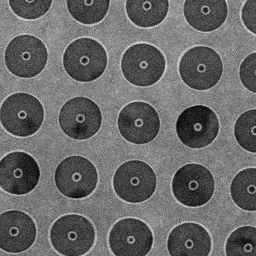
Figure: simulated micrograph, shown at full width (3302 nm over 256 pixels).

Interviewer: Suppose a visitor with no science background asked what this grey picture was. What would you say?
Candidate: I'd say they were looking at an array of small figures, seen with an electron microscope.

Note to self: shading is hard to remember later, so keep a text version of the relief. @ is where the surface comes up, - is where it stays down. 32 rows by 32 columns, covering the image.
@-----@@------@@--@--@@-----@@--
@@----@@@----@@@-----@@--@--@@--
@@@@@@@@@----@@@----@@@-----@@--
@@@@@@@@@@@@@@@@@@@@@@@@---@@@@-
@@--@@@@@@@@@@@@@@@@@@@@@@@@@@@@
@----@@@@----@@@@--@@@@@@@@@@@@@
@-----@@-----@@@----@@@----@@@@@
@-----@@--@--@@------@------@@--
@----@@@-----@@------@---@--@@--
@@--@@@@@----@@-----@@@-----@@--
@@@@@@@@@@@@@@@@@--@@@@----@@@--
@@@@@@@@@@@@@@@@@@@@@@@@@@@@@@@@
@----@@@@--@@@@@@@@@@@@@@@@@@@@@
-----@@@----@@@----@@@@---@@@@@@
--@---@------@@-----@@-----@@@--
-----@@------@@--@--@@-----@@---
@---@@@@----@@@-----@@-----@@---
@@@@@@@@@@@@@@@@---@@@@----@@@--
@@@@@@@@@@@@@@@@@@@@@@@@-@@@@@--
@---@@@@@-@@@@@@@@@@@@@@@@@@@@@@
-----@@-----@@@---@@@@@--@@@@@@@
--@--@@-----@@-----@@@----@@@@--
-----@@-----@@------@@-----@@---
----@@@-----@@-----@@------@@--@
@@@@@@@@---@@@@----@@@----@@@---
@@@@@@@@@@@@@@@@@@@@@@@---@@@---
@--@@@@@@@@@@@@@@@@@@@@@@@@@@@@@
----@@@----@@@@---@@@@@@@@@@@@@@
-----@------@@-----@@@----@@@@--
-----@------@@-----@@-----@@@---
----@@------@@-----@@--@---@----
@--@@@@----@@@-----@@-----@@----